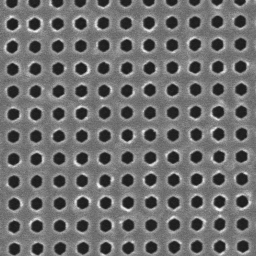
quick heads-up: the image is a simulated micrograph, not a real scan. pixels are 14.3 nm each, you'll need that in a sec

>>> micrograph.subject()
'a regular array of holes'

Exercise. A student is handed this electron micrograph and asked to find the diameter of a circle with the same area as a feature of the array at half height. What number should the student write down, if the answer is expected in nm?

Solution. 177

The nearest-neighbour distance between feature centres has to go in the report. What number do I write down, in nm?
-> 321